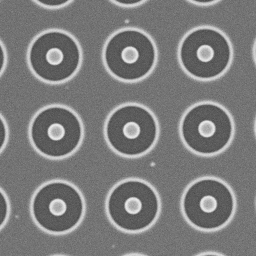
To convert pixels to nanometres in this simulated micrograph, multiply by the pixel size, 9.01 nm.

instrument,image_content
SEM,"an array of small figures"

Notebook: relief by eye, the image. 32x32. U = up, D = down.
UUUUUDDDUUUUUUUDDUUUUUUUUUUUUUUU
UUUUUUUUUUUUUUUUUUUUUUUUUUUUUUUU
UUUUUUUUUUUUUUUUUUUUUUUUUUUUUUUU
UUUUUUUUUUUUUUUUUUUUUUUUUUUUUUUU
UUUUUDDDDUUUUUDDDDUUUUUDDDDDUUUU
UUUUDDDDDDUUUDDDDDDUUUUDDDDDDUUU
DUUUDDUUDDUUUDDUUDDUUUUDDUUDDUUU
DUUUDDUUDDUUUDDDUDDUUUUDDUDDDUUU
UUUUDDDDDDUUUUDDDDDUUUUDDDDDUUUU
UUUUUDDDDUUUUUUDDDUUUUUUDDDUUUUU
UUUUUUUUUUUUUUUUUUUUUUUUUUUUUUUU
UUUUUUUUUUUUUUUUUUUUUUUUUUUUUUUU
UUUUUUUUUUUUUUUUUUUUUUUUUUUUUUUU
UUUUUUDDUUUUUUUDDDUUUUUUDDDDUUUU
UUUUUDDDDUUUUUDDDDDUUUUDDDDDDUUU
DUUUDDDDDDUUUDDDUDDUUUUDDUUDDUUU
DUUUDDUUDDUUUDDUUDDDUUUDDUUDDUUU
DUUUDDDDDDUUUUDDDDDUUUUDDDDDDUUU
UUUUUDDDDDUUUUDDDDDUUUUUDDDDUUUU
UUUUUUDDUUUUUUUUUUUUUUUUUUUUUUUU
UUUUUUUUUUUUUUUUUUUUUUUUUUUUUUUU
UUUUUUUUUUUUUUUUUUUUUUUUUUUUUUUU
UUUUUUUUUUUUUUUUDUUUUUUUUDDUUUUU
UUUUUDDDDUUUUUDDDDDUUUUUDDDDDUUU
DUUUDDDDDDUUUUDDDDDDUUUDDDDDDUUU
DUUUDDUUDDUUUDDDUUDDUUUDDUUDDUUU
DUUUDDUUDDUUUUDDUDDDUUUDDDDDDUUU
DUUUDDDDDDUUUUDDDDDUUUUUDDDDDUUU
UUUUUDDDDUUUUUUDDDUUUUUUUDDUUUUU
UUUUUUUUUUUUUUUUUUUUUUUUUUUUUUUU
UUUUUUUUUUUUUUUUUUUUUUUUUUUUUUUU
UUUUUUUUUUUUUUUUUUUUUUUUUUUUUUUU